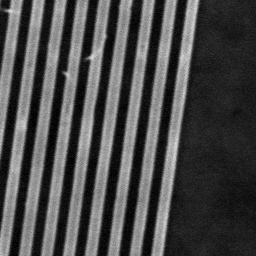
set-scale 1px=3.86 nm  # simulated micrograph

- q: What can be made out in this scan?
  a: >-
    parallel lines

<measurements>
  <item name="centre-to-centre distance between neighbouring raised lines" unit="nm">84.3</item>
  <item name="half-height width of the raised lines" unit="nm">40.1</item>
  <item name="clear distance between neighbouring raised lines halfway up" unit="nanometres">43.9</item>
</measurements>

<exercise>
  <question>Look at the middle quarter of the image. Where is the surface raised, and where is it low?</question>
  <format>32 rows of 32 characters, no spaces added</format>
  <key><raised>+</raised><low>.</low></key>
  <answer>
.+++...++...+++...++...+++...++.
.++...+++...++....++...++....++.
.++...+++...++....++...++....++.
.++...+++...++...+++...++...+++.
.++...+++...++...+++...++...+++.
+++...++...+++...++....++...+++.
+++...++...+++...++...+++...++..
+++...++...+++...++...+++...++..
++...+++...++....++...++....++..
++...+++...++....++...++....++..
++...++....++...+++...++...+++..
++...++....++...+++...++...+++..
++...++...+++...++....++...++...
++...++...+++...++...+++...++...
++...++...+++...++...+++...++...
+...+++...++....++...++....++...
+...+++...++....++...++....++...
+...+++...++...+++...++...+++...
+...+++...++...+++...++...+++...
+...++...+++...++....++...++....
+...++...+++...++...+++...++....
+...++...+++...++...+++...++....
...+++...++....++...++....++....
...+++...++....++...++....++....
...+++...++...+++...++...+++....
...+++...++...+++...++...+++....
...++...+++...++....++...++.....
...++...+++...++...+++...++.....
...++...+++...++...+++...++.....
...++...++....++...++....++.....
..+++...++....++...++....++.....
..+++...++...+++...++...+++.....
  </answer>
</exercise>